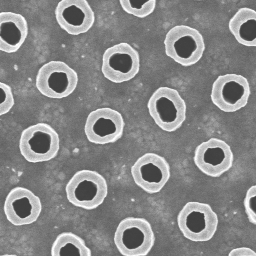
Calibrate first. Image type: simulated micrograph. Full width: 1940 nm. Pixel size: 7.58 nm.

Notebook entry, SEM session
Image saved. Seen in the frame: a regular array of ring-shaped raised bodies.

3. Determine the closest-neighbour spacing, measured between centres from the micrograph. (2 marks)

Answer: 0.493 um